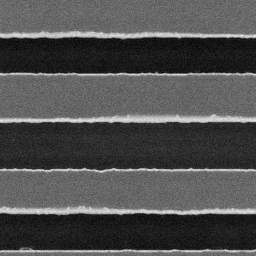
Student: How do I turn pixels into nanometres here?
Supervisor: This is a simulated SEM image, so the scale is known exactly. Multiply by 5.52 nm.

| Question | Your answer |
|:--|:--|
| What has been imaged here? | lines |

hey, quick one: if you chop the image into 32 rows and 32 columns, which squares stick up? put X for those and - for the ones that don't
XXXXXXXXXXXXXXXXXXXXXXXXXXXXXXXX
XXXXXXXXXXXXXXXXXXXXXXXXXXXXXXXX
XXXXXXXXXXXXXXXXXXXXXXXXXXXXXXXX
XXXXXXXXXXXXXXXXXXXXXXXXXXXXXXXX
XXXXXXXXXXXXXXXXXXXXXXXXXXXXXXXX
--------------------------------
--------------------------------
--------------------------------
--------------------------------
XXXXXXXXXXXXXXXXXXXXXXXXXXXXXXXX
XXXXXXXXXXXXXXXXXXXXXXXXXXXXXXXX
XXXXXXXXXXXXXXXXXXXXXXXXXXXXXXXX
XXXXXXXXXXXXXXXXXXXXXXXXXXXXXXXX
XXXXXXXXXXXXXXXXXXXXXXXXXXXXXXXX
XXXXXXXXXXXXXXXXXXXXXXXXXXXXXXXX
--------------------------------
--------------------------------
--------------------------------
--------------------------------
--------------------------------
--------------------------------
XXXXXXXXXXXXXXXXXXXXXXXXXXXXXXXX
XXXXXXXXXXXXXXXXXXXXXXXXXXXXXXXX
XXXXXXXXXXXXXXXXXXXXXXXXXXXXXXXX
XXXXXXXXXXXXXXXXXXXXXXXXXXXXXXXX
XXXXXXXXXXXXXXXXXXXXXXXXXXXXXXXX
XXXXXXXXXXXXXXXXXXXXXXXXXXXXXXXX
--------------------------------
--------------------------------
--------------------------------
--------------------------------
XXXXXXXXXXXXXXXXXXXXXXXXXXXXXXXX